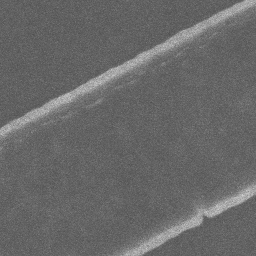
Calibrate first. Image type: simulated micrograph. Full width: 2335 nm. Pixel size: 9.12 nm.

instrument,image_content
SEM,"one or a few lines or trenches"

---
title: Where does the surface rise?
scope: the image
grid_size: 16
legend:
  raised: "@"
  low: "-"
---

---------------@
-------------@@@
-----------@@@@@
---------@@@@@@@
-------@@@@@@@@@
-----@@@@@@@@@@@
---@@@@@@@@@@@@@
--@@@@@@@@@@@@@@
@@@@@@@@@@@@@@@@
@@@@@@@@@@@@@@@@
@@@@@@@@@@@@@@@@
@@@@@@@@@@@@@@@@
@@@@@@@@@@@@@@@-
@@@@@@@@@@@@@---
@@@@@@@@@@@-----
@@@@@@@@@-------